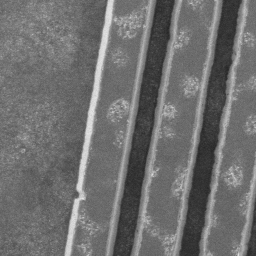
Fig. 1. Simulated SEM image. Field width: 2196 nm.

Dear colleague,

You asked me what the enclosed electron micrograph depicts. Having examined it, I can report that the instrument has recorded one or a few lines or trenches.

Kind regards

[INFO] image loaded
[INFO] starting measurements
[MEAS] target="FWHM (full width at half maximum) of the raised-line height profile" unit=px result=41.4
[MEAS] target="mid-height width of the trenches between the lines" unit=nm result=203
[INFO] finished